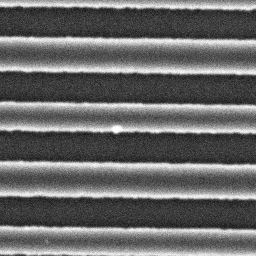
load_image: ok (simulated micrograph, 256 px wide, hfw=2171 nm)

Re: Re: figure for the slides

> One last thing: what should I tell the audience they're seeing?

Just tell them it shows lines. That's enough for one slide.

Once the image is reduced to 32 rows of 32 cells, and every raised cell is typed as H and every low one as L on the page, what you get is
HHHHHHHHHHHHHHHHHHHHHHHHHHHHHHHH
LLLLLLLLLLLLLLLLLLLLLLLLLLLLLLLL
LLLLLLLLLLLLLLLLLLLLLLLLLLLLLLLL
LLLLLLLLLLLLLLLLLLLLLLLLLLLLLLLL
LLLLLLLLLLLLLLLLLLLLLLLLLLLLLLLL
HHHHHHHHHHHHHHHHHHHHHHHHHHHHHHHH
HHHHHHHHHHHHHHHHHHHHHHHHHHHHHHHH
HHHHHHHHHHHHHHHHHHHHHHHHHHHHHHHH
HHHHHHHHHHHHHHHHHHHHHHHHHHHHHHHH
LLLLLLLLLLLLLLLLLLLLLLLLLLLLLLLL
LLLLLLLLLLLLLLLLLLLLLLLLLLLLLLLL
LLLLLLLLLLLLLLLLLLLLLLLLLLLLLLLL
LLLLLLLLLLLLLLLLLLLLLLLLLLLLLLLL
HHHHHHHHHHHHHHHHHHHHHHHHHHHHHHHH
HHHHHHHHHHHHHHHHHHHHHHHHHHHHHHHH
HHHHHHHHHHHHHHHHHHHHHHHHHHHHHHHH
LLLLLLLLLLLLLLHLLLLHLLHHHHHHHHHH
LLLLLLLLLLLLLLLLLLLLLLLLLLLLLLLL
LLLLLLLLLLLLLLLLLLLLLLLLLLLLLLLL
LLLLLLLLLLLLLLLLLLLLLLLLLLLLLLLL
HHHHHHHHHHHHHHHHLHLLLLLLLLLLLLLL
HHHHHHHHHHHHHHHHHHHHHHHHHHHHHHHH
HHHHHHHHHHHHHHHHHHHHHHHHHHHHHHHH
HHHHHHHHHHHHHHHHHHHHHHHHHHHHHHHH
LLLHLLHHHHHHHHHHHHHHHHHHHHHHHHHH
LLLLLLLLLLLLLLLLLLLLLLLLLLLLLLLL
LLLLLLLLLLLLLLLLLLLLLLLLLLLLLLLL
LLLLLLLLLLLLLLLLLLLLLLLLLLLLLLLL
HHHHHHHLHHLLLLLLLLLLLLLLLLLLLLLL
HHHHHHHHHHHHHHHHHHHHHHHHHHHHHHHH
HHHHHHHHHHHHHHHHHHHHHHHHHHHHHHHH
HHHHHHHHHHHHHHHHHHHHHHHHHHHHHHHH